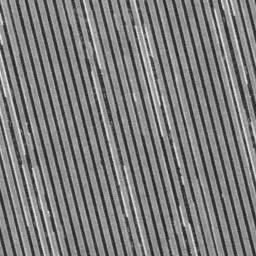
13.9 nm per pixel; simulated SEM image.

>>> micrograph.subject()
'parallel lines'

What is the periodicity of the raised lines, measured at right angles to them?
124 nanometers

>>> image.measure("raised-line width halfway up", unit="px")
5.35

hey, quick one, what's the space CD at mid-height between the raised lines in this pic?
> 0.0505 micrometres